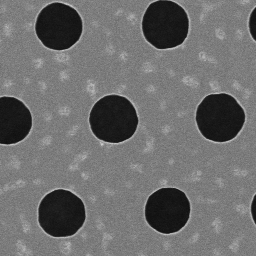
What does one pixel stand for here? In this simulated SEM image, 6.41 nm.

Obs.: holes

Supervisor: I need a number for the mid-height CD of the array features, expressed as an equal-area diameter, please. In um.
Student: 0.305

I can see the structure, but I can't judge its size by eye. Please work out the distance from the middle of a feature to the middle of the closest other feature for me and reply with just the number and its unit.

680 nm